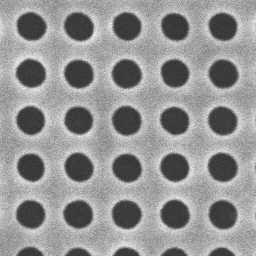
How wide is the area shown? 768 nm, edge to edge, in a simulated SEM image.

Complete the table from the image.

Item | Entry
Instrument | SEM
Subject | a regular array of holes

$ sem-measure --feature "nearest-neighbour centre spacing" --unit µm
0.14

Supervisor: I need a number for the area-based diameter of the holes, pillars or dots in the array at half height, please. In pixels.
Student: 29.3